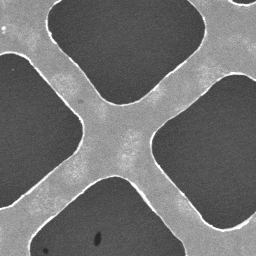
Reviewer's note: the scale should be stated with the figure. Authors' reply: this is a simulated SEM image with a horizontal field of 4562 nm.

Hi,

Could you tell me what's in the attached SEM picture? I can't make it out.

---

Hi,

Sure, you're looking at holes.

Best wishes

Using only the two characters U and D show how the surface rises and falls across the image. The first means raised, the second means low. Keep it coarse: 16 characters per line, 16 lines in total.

UUUDDDDDDDDDUUUU
UUUDDDDDDDDDDUUU
UUUDDDDDDDDDDUUU
DUUUDDDDDDDDUUUU
DDUUUDDDDDDUUUUU
DDDUUUDDDDUUUDDD
DDDDUUUDUUUUDDDD
DDDDDUUUUUUDDDDD
DDDDDUUUUUDDDDDD
DDDDDUUUUUDDDDDD
DDDDUUUUUUDDDDDD
DDUUUUDDUUUDDDDD
DUUUUDDDDUUUDDDD
UUUDDDDDDDUUUDDD
UUDDDDDDDDDUUUUU
UUDDDDDDDDDDUUUU